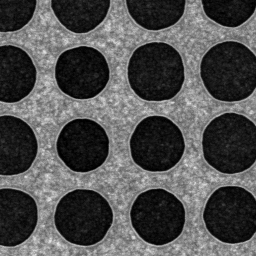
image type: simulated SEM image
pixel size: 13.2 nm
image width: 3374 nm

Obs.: holes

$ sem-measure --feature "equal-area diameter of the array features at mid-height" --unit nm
732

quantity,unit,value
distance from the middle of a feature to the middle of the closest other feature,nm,952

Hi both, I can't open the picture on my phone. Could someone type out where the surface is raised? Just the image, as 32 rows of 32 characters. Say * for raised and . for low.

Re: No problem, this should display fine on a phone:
.....*........**.......**.......
....***......***.......***......
....***......****.....****.....*
...*****....******...***********
********************************
******************...******...**
...*****....*****.....****......
....***......***.......**.......
....***.......**.......**.......
.....**.......**.......**.......
....***......***.......**.......
....****.....****.....****......
...***************...******...**
********************************
..*****************.*******....*
...*****....*****.....****......
....****.....****......**.......
.....**.......**.......**.......
.....**.......**.......**.......
.....**......***.......***......
....****.....****.....****......
...*******.*****************..**
********************************
***************************...**
....****.....****.....****......
....***.......***......***......
.....**.......**.......**.......
.....**.......**.......**.......
....***.......***......***......
....****.....****.....*****.....
...******...*******..***********
********************************